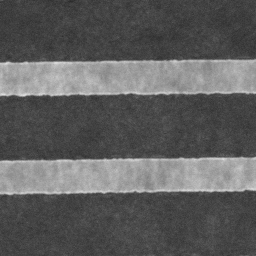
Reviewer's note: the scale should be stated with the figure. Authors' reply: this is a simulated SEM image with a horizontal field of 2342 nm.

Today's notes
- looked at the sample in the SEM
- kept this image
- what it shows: lines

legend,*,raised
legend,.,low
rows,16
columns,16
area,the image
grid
................
................
................
................
****************
****************
................
................
................
................
****************
****************
................
................
................
................